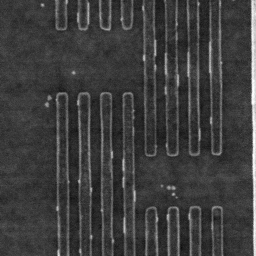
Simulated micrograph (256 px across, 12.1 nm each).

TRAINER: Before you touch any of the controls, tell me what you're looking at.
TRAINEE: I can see wiring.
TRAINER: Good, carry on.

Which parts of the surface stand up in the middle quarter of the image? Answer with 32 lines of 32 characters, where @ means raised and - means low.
--------------------@@@---@@---@
--------------------@@@---@@---@
--------------------@@@---@@---@
--------------------@@@---@@---@
--------------------@@@---@@---@
--------------------@@@---@@----
--------------------@@@---@@----
----@@----@@---@@---@@@---@@----
@---@@---@@@---@@---@@@---@@----
@---@@---@@@---@@---@@@---@@----
@---@@---@@@---@@---@@@---@@----
@---@@---@@@---@@---@@@---@@----
@---@@---@@@---@@---@@@---@@----
@---@@---@@@---@@---@@@---@@----
@---@@----@@---@@---@@@---@@---@
@---@@----@@---@@---@@@---@@---@
@---@@----@@---@@---@@@---@@----
@---@@----@@---@@---@@@---@@----
@---@@----@@---@@---@@@---@@----
@---@@----@@---@@---@@@---@@----
@---@@----@@---@@---@@@---@@----
@---@@----@@---@@---@@@---@@----
@---@@----@@---@@----@@---@@----
@---@@----@@---@@---------------
@---@@----@@---@@---------------
@---@@----@@---@@---------------
@---@@----@@---@@---------------
@---@@----@@---@@---------------
@---@@----@@---@@---------------
@---@@----@@---@@---------------
@---@@@---@@---@@---------------
@---@@@---@@---@@---------------